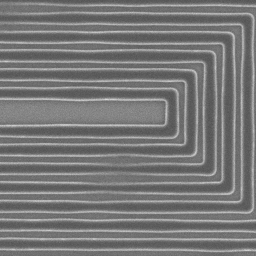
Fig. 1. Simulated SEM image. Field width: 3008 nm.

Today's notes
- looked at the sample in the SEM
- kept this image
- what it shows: groups of lines, slits or small figures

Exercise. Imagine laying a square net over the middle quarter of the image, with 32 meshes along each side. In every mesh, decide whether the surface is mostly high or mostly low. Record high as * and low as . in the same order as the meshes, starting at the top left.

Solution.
................................
********************************
********************************
********************************
..............................**
..............................**
****************************..**
****************************..**
*****************************.**
.........................****.**
..........................***.**
..........................***.**
..........................***.**
..........................***.**
.........................****.**
*****************************.**
*****************************.**
****************************..**
.......................****...**
..............................**
********************************
********************************
********************************
................................
................................
********************************
********************************
*****..............*************
................................
................................
********************************
********************************